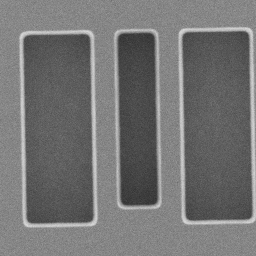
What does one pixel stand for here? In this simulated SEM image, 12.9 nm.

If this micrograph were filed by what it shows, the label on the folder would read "groups of lines, slits or small figures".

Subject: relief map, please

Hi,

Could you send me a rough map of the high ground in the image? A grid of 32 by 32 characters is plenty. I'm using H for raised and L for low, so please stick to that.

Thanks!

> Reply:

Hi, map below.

HHHHHHHHHHHHHHHHHHHHHHHHHHHHHHHH
HHHHHHHHHHHHHHHHHHHHHHHHHHHHHHHH
HHHHHHHHHHHHHHHHHHHHHHHHHHHHHHHH
HHHHHHHHHHHHHHHHHHHHHHHHHHHHHHHH
HHHLLLLLLLLHHHHLLLLHHHHLLLLLLLLH
HHHLLLLLLLLLHHHLLLLLHHHLLLLLLLLH
HHHLLLLLLLLLHHHLLLLLHHHLLLLLLLLH
HHHLLLLLLLLLHHHLLLLLHHHLLLLLLLLH
HHHLLLLLLLLLHHHLLLLLHHHLLLLLLLLH
HHHLLLLLLLLLHHHLLLLLHHHLLLLLLLLL
HHHLLLLLLLLLHHHLLLLLHHHLLLLLLLLL
HHHLLLLLLLLLHHHLLLLLHHHLLLLLLLLL
HHHLLLLLLLLLHHHLLLLLHHHLLLLLLLLL
HHHLLLLLLLLLHHHLLLLLHHHLLLLLLLLL
HHHLLLLLLLLLHHHLLLLLHHHLLLLLLLLL
HHHLLLLLLLLLHHHLLLLLHHHLLLLLLLLL
HHHLLLLLLLLLHHHLLLLLHHHLLLLLLLLL
HHHLLLLLLLLLHHHLLLLLHHHLLLLLLLLL
HHHLLLLLLLLLHHHLLLLLHHHLLLLLLLLL
HHHLLLLLLLLLHHHLLLLLHHHLLLLLLLLL
HHHLLLLLLLLLHHHLLLLLHHHLLLLLLLLL
HHHLLLLLLLLLHHHLLLLLHHHLLLLLLLLL
HHHLLLLLLLLLHHHLLLLLHHHLLLLLLLLL
HHHLLLLLLLLLHHHLLLLLHHHLLLLLLLLL
HHHLLLLLLLLLHHHLLLLLHHHLLLLLLLLL
HHHLLLLLLLLLHHHLLLLLHHHLLLLLLLLL
HHHLLLLLLLLLHHHHHHHHHHHLLLLLLLLL
HHHLLLLLLLLLHHHHHHHHHHHLLLLLLLLH
HHHHHHHHHHHHHHHHHHHHHHHHHHHHHHHH
HHHHHHHHHHHHHHHHHHHHHHHHHHHHHHHH
HHHHHHHHHHHHHHHHHHHHHHHHHHHHHHHH
HHHHHHHHHHHHHHHHHHHHHHHHHHHHHHHH